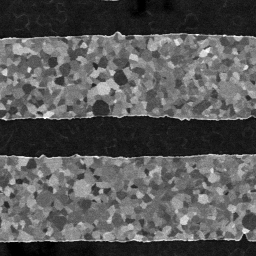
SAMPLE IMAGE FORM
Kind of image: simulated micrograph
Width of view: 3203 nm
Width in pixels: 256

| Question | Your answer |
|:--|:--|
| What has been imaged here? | one or a few lines or trenches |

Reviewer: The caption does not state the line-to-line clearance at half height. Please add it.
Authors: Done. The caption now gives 480 nanometers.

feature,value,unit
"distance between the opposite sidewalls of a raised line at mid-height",1050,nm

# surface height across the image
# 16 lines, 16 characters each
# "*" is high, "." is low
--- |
................
................
****************
****************
****************
****************
****************
................
................
................
****************
****************
****************
****************
****************
................